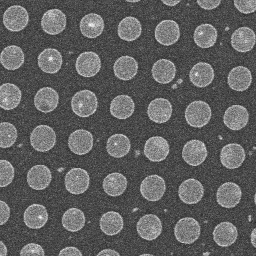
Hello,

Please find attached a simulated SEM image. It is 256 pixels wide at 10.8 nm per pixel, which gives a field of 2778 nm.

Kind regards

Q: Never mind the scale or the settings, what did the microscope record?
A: a regular array of raised bodies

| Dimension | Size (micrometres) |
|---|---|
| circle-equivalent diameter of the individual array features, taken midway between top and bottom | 0.265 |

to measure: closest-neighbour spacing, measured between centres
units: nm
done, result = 412